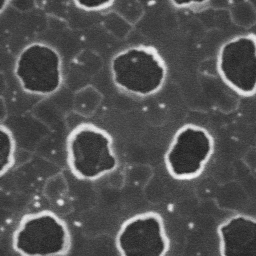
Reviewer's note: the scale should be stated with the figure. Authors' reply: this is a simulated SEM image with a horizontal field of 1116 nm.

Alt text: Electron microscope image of holes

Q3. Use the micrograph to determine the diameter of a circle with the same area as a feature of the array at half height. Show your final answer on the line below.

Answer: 198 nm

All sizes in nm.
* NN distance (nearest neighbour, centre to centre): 414